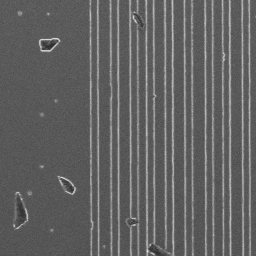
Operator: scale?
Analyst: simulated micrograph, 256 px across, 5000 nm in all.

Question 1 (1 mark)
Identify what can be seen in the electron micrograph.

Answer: parallel lines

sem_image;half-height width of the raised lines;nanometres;146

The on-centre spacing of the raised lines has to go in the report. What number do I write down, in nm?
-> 370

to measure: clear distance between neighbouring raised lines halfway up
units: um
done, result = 0.237